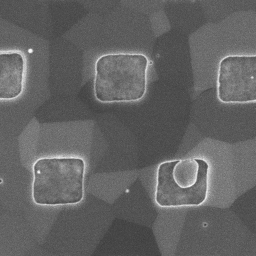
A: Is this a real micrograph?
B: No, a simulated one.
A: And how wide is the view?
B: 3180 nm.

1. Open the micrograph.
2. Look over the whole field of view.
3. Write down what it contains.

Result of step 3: holes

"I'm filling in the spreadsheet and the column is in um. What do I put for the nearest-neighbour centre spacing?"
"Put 0.949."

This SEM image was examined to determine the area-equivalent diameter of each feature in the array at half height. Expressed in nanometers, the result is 562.